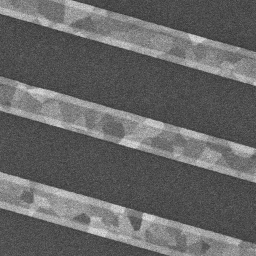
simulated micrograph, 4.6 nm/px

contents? one or a few lines or trenches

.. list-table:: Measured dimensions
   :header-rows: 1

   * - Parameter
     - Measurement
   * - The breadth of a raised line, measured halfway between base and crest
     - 127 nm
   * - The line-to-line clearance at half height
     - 300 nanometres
